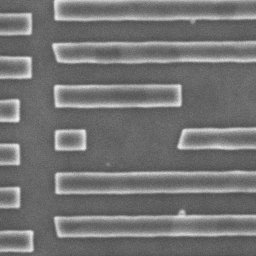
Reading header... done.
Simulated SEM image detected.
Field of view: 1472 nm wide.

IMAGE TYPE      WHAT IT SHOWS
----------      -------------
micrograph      wiring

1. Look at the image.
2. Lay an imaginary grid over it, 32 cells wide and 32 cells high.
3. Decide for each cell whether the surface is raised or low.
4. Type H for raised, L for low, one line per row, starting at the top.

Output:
LLLLLLLHHHHHHHHHHHHHHHHHHHHHHHHH
LLLLLLLHHHHHHHHHHHHHHHHHHHHHHHHH
HHHHLLLLLLHLLLLLLLLLLLLLLLLLLLLL
HHHHLLLLLLLLLLLLLLLLLLLLLLLLLLLL
LLLLLLLLLLLLLLLLLLLLLLLLLLLLLLLL
LLLLLLLLHHHHHHHHHHHHHHHHHHHHHHHH
LLLLLLLHHHHHHHHHHHHHHHHHHHHHHHHH
HHHHLLLHHHHHHHHHHHHHHHHHHHHHHHHH
HHHHLLLLLLLLLLLLLLLLLLLLLLLLLLLL
HHHHLLLLLLLLLLLLLLLLLLLLLLLLLLLL
LLLLLLLLLLLLLLLLLLLLLLLLLLLLLLLL
LLLLLLLHHHHHHHHHHHHHHHHLLLLLLLLL
LHLLLLLHHHHHHHHHHHHHHHHLLLLLLLLL
HHLLLLLLLLLLLLLLLLLLLLLLLLLLLLLL
HHLLLLLLLLLLLLLLLLLLLLLLLLLLLLLL
LLLLLLLLLLLLLLLLLLLLLLLLLLLLLLLL
LLLLLLLHHHHLLLLLLLLLLLLHHHHHHHHH
LLLLLLLHHHHLLLLLLLLLLLLHHHHHHHHH
HHLLLLLHHHHLLLLLLLLLLLLHHHLHHHHL
HHLLLLLLLLLLLLLLLLLLLLLLLLLLLLLL
HHLLLLLLLLLLLLLLLLLLLLLLLLLLLLLL
LLLLLLLLLLLLLLLLLLLLLLLLLLLLLHHL
LLLLLLLHHHHHHHHHHHHHHHHHHHHHHHHH
HHLLLLLHHHHHHHHHHHHHHHHHHHHHHHHH
HHLLLLLLLLLLLLLLLLLLLLLLLLLLLLLL
HHLLLLLLLLLLLLLLLLLLLLLLLLLLLLLL
LLLLLLLLLLLLLLLLLLLLLLLLLLLLLLLL
LLLLLLLHHHHHHHHHHHHHHHHHHHHHHHHH
LLLLLLLHHHHHHHHHHHHHHHHHHHHHHHHH
HHHHLLLLHHHLHHLLLLLLLLLLLLLLLLLL
HHHHLLLLLLLLLLLLLLLLLLLLLLLLLLLL
LLLLLLLLLLLLLLLLLLLLLLLLLLLLLLLL